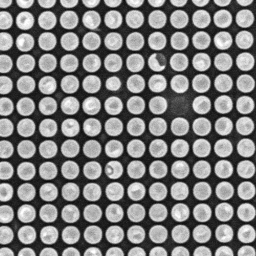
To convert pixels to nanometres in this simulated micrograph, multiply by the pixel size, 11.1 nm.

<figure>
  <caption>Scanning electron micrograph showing a regular array of raised bodies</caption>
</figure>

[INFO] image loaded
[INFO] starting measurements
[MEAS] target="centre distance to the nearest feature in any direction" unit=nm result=235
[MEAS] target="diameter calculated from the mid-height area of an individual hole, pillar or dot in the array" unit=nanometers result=193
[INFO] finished